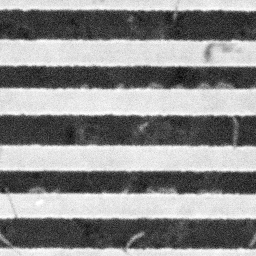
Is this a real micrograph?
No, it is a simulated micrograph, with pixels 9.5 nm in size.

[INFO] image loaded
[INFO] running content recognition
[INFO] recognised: lines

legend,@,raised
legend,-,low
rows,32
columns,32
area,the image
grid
@@@@@@@@@@@@@@@@@@@@@@@@@@@@@@@@
--------------------------------
--------------------------------
--------------------------------
--------------------------------
@@@@@@@@@@@@@@@@@@@@@@@@@@@@@@@@
@@@@@@@@@@@@@@@@@@@@@@@@@@@@@@@@
@@@@@@@@@@@@@@@@@@@@@@@@@@@@@@@@
--------------------------------
--------------------------------
--------------------------------
@@@@@@@@@@@@@@@@@@@@@@@@@@@@@@@@
@@@@@@@@@@@@@@@@@@@@@@@@@@@@@@@@
@@@@@@@@@@@@@@@@@@@@@@@@@@@@@@@@
--------------------------------
--------------------------------
--------------------------------
--------------------------------
@@@@@@@@@@@@@@@@@@@@@@@@@@@@@@@@
@@@@@@@@@@@@@@@@@@@@@@@@@@@@@@@@
@@@@@@@@@@@@@@@@@@@@@@@@@@@@@@@@
--------------------------------
--------------------------------
--------------------------------
@@@@@@@@@@@@@@@@@@@@@@@@@@@@@@@@
@@@@@@@@@@@@@@@@@@@@@@@@@@@@@@@@
@@@@@@@@@@@@@@@@@@@@@@@@@@@@@@@@
--------------------------------
--------------------------------
--------------------------------
--------------------------------
@@@@@@@@@@@@@@@@@@@@@@@@@@@@@@@@